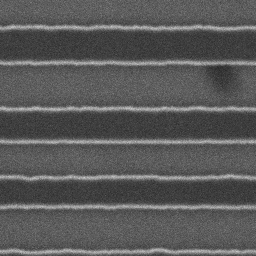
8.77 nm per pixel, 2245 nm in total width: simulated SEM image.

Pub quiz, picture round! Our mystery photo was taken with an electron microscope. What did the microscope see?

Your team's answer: lines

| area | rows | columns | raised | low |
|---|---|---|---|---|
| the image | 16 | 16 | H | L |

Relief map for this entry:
LLLLLLLLLLLLLLLL
LLLLLLLLLLLLLLLL
HHHHHHHHHHHHHHHH
HHHHHHHHHHHHHHHH
LLLLLLLLLLLLLLLL
LLLLLLLLLLLLLLLL
LLLLLLLLLLLLLLLL
HHHHHHHHHHHHHHHH
HHHHHHHHHHHHHHHH
LLLLLLLLLLLLLLLL
LLLLLLLLLLLLLLLL
HHHHHHHHHHHHHHHH
HHHHHHHHHHHHHHHH
LLLLLLLLLLLLLLLL
LLLLLLLLLLLLLLLL
LLLLLLLLLLLLLLLL